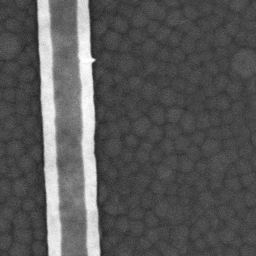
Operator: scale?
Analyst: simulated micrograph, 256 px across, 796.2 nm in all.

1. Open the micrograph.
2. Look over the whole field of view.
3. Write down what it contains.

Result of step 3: one or a few lines or trenches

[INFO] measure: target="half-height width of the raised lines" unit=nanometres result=121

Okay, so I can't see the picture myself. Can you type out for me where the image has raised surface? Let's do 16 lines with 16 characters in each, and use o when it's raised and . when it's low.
...oo...........
...oo...........
...oo...........
...oo...........
...oo...........
...oo...........
...oo...........
...ooo..........
...ooo..........
...ooo..........
...ooo..........
...ooo..........
...ooo..........
...ooo..........
...ooo..........
...ooo..........